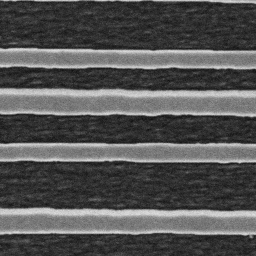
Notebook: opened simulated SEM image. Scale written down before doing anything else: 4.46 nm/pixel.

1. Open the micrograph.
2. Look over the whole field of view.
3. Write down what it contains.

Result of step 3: lines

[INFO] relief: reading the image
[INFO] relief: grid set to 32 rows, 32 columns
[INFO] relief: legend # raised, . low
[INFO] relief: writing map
................................
................................
................................
................................
................................
................................
################################
################################
................####.......#####
................................
................................
#########...####................
################################
################################
...............................#
................................
................................
................................
################################
################################
................................
................................
................................
................................
................................
................................
##############.#####............
################################
################################
................................
................................
................................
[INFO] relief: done